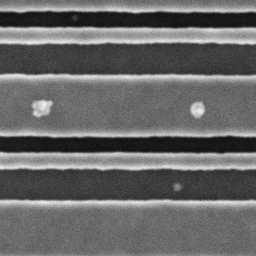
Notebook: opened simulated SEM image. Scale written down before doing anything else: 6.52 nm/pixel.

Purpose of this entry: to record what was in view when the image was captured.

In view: lines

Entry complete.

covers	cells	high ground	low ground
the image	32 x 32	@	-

@@@@@@@@@@@@@@@@@@@@@@@@@@@@@@@@
----------------@@---------@@@--
--------------------------------
@@@@@@@@@@@@@-@@-@@----@@-----@@
@@@@@@@@@@@@@@@@@@@@@@@@@@@@@@@@
--------------------------------
--------------------------------
--------------------------------
--------------------------------
@@@@@@@@@@@@@@@@@@@@@@@@@--@----
@@@@@@@@@@@@@@@@@@@@@@@@@@@@@@@@
@@@@@@@@@@@@@@@@@@@@@@@@@@@@@@@@
@@@@@@@@@@@@@@@@@@@@@@@@@@@@@@@@
@@@@@@@@@@@@@@@@@@@@@@@@@@@@@@@@
@@@@@@@@@@@@@@@@@@@@@@@@@@@@@@@@
@@@@@@@@@@@@@@@@@@@@@@@@@@@@@@@@
@@@@@@@@@@@@@@@@@@@@@@@@@@@@@@@@
--------------------------------
--------------------------------
@@@@@@@@@@@@@@@@@@@@@@@@@@@@@@@@
@@@@@@@@@@@@@@@@@@@@@@@@@@@@@@@@
--------------------------------
--------------------------------
--------------------------------
--------------------------------
@@@@@@@@@@@@@@@@@@@@@@@@@@@@@@@@
@@@@@@@@@@@@@@@@@@@@@@@@@@@@@@@@
@@@@@@@@@@@@@@@@@@@@@@@@@@@@@@@@
@@@@@@@@@@@@@@@@@@@@@@@@@@@@@@@@
@@@@@@@@@@@@@@@@@@@@@@@@@@@@@@@@
@@@@@@@@@@@@@@@@@@@@@@@@@@@@@@@@
@@@@@@@@@@@@@@@@@@@@@@@@@@@@@@@@